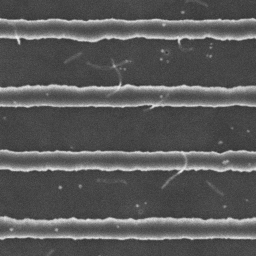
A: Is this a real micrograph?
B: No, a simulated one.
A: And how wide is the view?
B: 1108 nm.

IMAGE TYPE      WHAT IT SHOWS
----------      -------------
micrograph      lines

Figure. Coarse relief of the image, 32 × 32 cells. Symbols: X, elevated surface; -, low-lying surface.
--------------------------------
--------------------------------
X-X---XX-----XX----X-------X--XX
XXXXXXXXXXXXXXXXXXXXXXXXXXXXXXXX
XXXXXXXXXXXXXXXXXXXXXXXXXXXXXXXX
--------------------------------
--------------------------------
--------------------------------
--------------------------------
--------------------------------
--------------------------------
XXXXXXXXXXXXXXXXXXXXXXXXXXXXXXXX
XXXXXXXXXXXXXXXXXXXXXXXXXXXXXXXX
--------------------------------
--------------------------------
--------------------------------
--------------------------------
--------------------------------
--------------------------------
XXXXXXXXXXXXXXXXXXXXXXXXXXXXXXXX
XXXXXXXXXXXXXXXXXXXXXXXXXXXXXXXX
--------------------------------
--------------------------------
--------------------------------
--------------------------------
--------------------------------
--------------------------------
XX-----XXX-XXXX-X-XXXXXXX---X--X
XXXXXXXXXXXXXXXXXXXXXXXXXXXXXXXX
XXXXXXXXXXXXXXXXXXXXXXXXXXXXXXXX
--------------------------------
--------------------------------